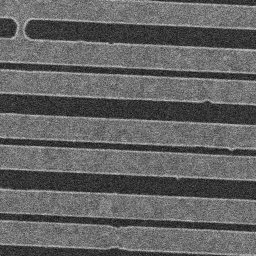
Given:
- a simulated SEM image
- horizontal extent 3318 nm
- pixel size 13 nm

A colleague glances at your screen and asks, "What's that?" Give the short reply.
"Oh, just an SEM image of parallel lines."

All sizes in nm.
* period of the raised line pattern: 481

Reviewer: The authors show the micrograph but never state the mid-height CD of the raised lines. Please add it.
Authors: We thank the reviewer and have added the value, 0.299 um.